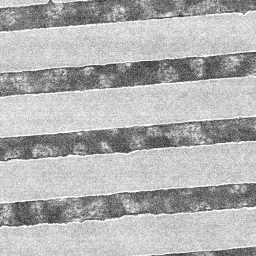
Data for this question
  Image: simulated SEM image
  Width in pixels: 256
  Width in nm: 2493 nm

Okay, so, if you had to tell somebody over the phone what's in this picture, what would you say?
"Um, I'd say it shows one or a few lines or trenches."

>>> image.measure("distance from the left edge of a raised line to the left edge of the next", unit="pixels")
64.8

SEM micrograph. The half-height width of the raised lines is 40.2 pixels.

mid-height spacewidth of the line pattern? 242 nm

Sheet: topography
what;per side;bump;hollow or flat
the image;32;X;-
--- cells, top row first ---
XXXXX---------------------------
-------------------------------X
-------------------XXXXXXXXXXXXX
------XXXXXXXXXXXXXXXXXXXXXXXXXX
XXXXXXXXXXXXXXXXXXXXXXXXXXXXXXXX
XXXXXXXXXXXXXXXXXXXXXXXXXXXXXXXX
XXXXXXXXXXXXXXXXXXXXXXXXXXXXXXX-
XXXXXXXXXXXXXXXXXXXX------------
XXXXXX--------------------------
--------------------------------
---------------------XXXXXXXXXXX
---------XXXXXXXXXXXXXXXXXXXXXXX
XXXXXXXXXXXXXXXXXXXXXXXXXXXXXXXX
XXXXXXXXXXXXXXXXXXXXXXXXXXXXXXXX
XXXXXXXXXXXXXXXXXXXXXXXXXXXXXXXX
XXXXXXXXXXXXXXXXXXXX------------
XXXXXXXX------------------------
--------------------------------
---------------------XXXXXXXXXXX
---------XXXXXXXXXXXXXXXXXXXXXXX
XXXXXXXXXXXXXXXXXXXXXXXXXXXXXXXX
XXXXXXXXXXXXXXXXXXXXXXXXXXXXXXXX
XXXXXXXXXXXXXXXXXXXXXXXXXXXXXXXX
XXXXXXXXXXXXXXXXXXXXXX----------
XXXXXXXXXXX---------------------
--------------------------------
-------------------------XXXXXXX
-------------XXXXXXXXXXXXXXXXXXX
XXXXXXXXXXXXXXXXXXXXXXXXXXXXXXXX
XXXXXXXXXXXXXXXXXXXXXXXXXXXXXXXX
XXXXXXXXXXXXXXXXXXXXXXXXXXXXXXXX
XXXXXXXXXXXXXXXXXXXXXXXX--------